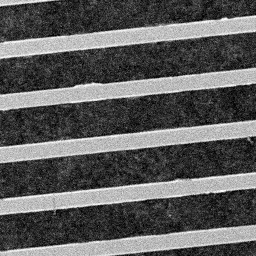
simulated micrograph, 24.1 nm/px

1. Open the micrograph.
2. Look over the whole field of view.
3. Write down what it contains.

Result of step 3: parallel lines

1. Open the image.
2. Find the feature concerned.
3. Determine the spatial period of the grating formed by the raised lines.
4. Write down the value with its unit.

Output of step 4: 1250 nanometers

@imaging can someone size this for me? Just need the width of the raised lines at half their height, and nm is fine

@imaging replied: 347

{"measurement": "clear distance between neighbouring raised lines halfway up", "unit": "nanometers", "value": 889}